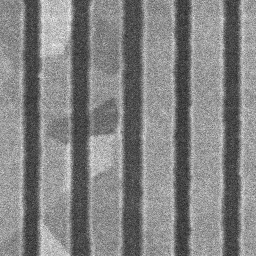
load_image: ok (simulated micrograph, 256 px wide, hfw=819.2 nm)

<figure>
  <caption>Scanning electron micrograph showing parallel lines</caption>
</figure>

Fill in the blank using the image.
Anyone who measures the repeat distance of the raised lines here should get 161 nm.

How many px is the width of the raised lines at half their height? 32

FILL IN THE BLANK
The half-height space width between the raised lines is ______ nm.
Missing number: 54.3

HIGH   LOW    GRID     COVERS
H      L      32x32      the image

HHHLLHHHHLLHHHHLLLHHHHLLHHHHLLHH
HHHLLHHHHLLHHHHLLLHHHHLLHHHHLLHH
HHHLLHHHHLLHHHHLLLHHHHLLHHHHLLHH
HHHLLHHHHLLHHHHLLLHHHHLLHHHHLLHH
HHHLLHHHHLLHHHHLLLHHHHLLHHHHLLHH
HHHLLHHHHLLHHHHLLLHHHHLLHHHHLLHH
HHHLLHHHHLLHHHHLLLHHHHLLHHHHLLHH
HHHLLHHHHLLHHHHLLLHHHHLLHHHHLLHH
HHHLLHHHHLLHHHHLLLHHHHLLHHHHLLHH
HHHLLHHHHLLHHHHLLLHHHHLLHHHHLLHH
HHHLLHHHHLLHHHHLLLHHHHLLHHHHLLHH
HHHLLHHHHLLHHHHLLLHHHHLLHHHHLLHH
HHHLLHHHHLLHHHHLLLHHHHLLHHHHLLHH
HHHLLHHHHLLHHHHLLLHHHHLLHHHHLLHH
HHHLLHHHHLLHHHHLLLHHHHLLHHHHLLHH
HHHLLHHHHLLHHHHLLLHHHHLLHHHHLLHH
HHHLLHHHHLLHHHHLLLHHHHLLHHHHLLHH
HHHLLHHHHLLHHHHLLLHHHHLLHHHHLLHH
HHHLLHHHHLLHHHHLLLHHHHLLHHHHLLHH
HHHLLHHHHLLHHHHLLLHHHHLLHHHHLLHH
HHHLLHHHHLLHHHHLLLHHHHLLHHHHLLHH
HHHLLHHHHLLHHHHLLLHHHHLLHHHHLLHH
HHHLLHHHHLLHHHHLLLHHHHLLHHHHLLHH
HHHLLHHHHLLHHHHLLLHHHHLLHHHHLLHH
HHHLLHHHHLLHHHHLLLHHHHLLHHHHLLHH
HHHLLHHHHLLHHHHLLLHHHHLLHHHHLLHH
HHHLLHHHHLLHHHHLLLHHHHLLHHHHLLHH
HHHLLHHHHLLHHHHLLLHHHHLLHHHHLLHH
HHHLLHHHHLLHHHHLLLHHHHLLHHHHLLHH
HHHLLHHHHLLHHHHLLLHHHHLLHHHHLLHH
HHHLLHHHHLLHHHHLLLHHHHLLHHHHLLHH
HHHLLHHHHLLHHHHLLLHHHHLLHHHHLLHH